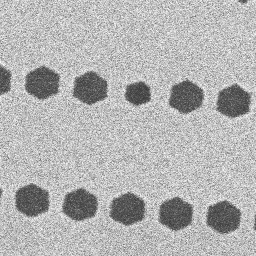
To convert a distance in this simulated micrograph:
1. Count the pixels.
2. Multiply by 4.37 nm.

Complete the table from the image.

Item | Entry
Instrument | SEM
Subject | a regular array of holes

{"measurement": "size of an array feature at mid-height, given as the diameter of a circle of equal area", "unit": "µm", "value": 0.148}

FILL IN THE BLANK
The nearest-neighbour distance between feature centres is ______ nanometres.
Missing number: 209